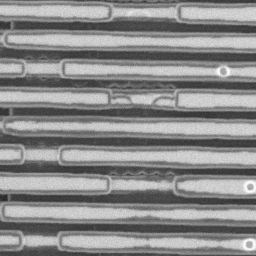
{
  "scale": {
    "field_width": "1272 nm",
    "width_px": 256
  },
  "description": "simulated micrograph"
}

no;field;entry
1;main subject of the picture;wiring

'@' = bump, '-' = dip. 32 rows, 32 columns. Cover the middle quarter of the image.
@@@@@@@@@@@@@@@@@@@@@@@@@@@@@@@@
@@@@@@@@@@@@@@@@@@@@@@@@@@@@@@@@
@@@@@@@@@@@@@@@@@@@@@@@@@@@@@@@@
-------@@@@@@@-@@@@@@@@@@@@@@@@@
--------------------------------
--------------------------------
@@@@@@@@@@@-----------------@-@@
@@@@@@@@@@@@----------------@@@@
@@@@@@@@@@@@@@@@@------@@@@@@@@@
@@@@@@@@@@@@@@@@@-----@@@@@@@@@@
@@@@@@@@@@@@@@@@@------@@@@@@@@@
-----------------------------@@@
--------------------------------
@@@@@@@@@@@@--------------------
@@@@@@@@@@@@@@@@@@@@@@@@@@@@@@@@
@@@@@@@@@@@@@@@@@@@@@@@@@@@@@@@@
@@@@@@@@@@@@@@@@@@@@@@@@@@@@@@@@
@@@@@@@@@@@@@@@@@@@@@@@@@@@@@@@@
--------------------------------
--------------------------------
--------------------------------
@@@@@@@@@@@@@@@@@@@@@@@@@@@@@@@@
@@@@@@@@@@@@@@@@@@@@@@@@@@@@@@@@
@@@@@@@@@@@@@@@@@@@@@@@@@@@@@@@@
@@@@@@@@@@@@@@@@@@@@@@@@@@@@@@@@
---------------------@@@@@@@@@@@
--------------------------------
@@------------------------------
@@@@@@@@@@@@----------------@@@@
@@@@@@@@@@@@---------------@@@@@
@@@@@@@@@@@@---------------@@@@@
@@@@@@@@@@@@----------------@@@@